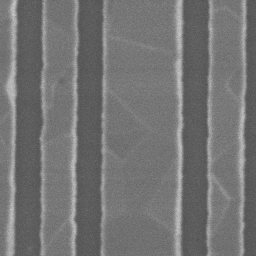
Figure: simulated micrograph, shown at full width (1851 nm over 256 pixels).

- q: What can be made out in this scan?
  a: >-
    lines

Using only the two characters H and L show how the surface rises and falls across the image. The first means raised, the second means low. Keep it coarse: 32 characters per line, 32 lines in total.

HHLLLHHHHHLLLHHHHHHHHHHLLLHHHHHL
HHLLLHHHHHLLLHHHHHHHHHHLLLHHHHHL
HHLLLHHHHHLLLHHHHHHHHHHLLLHHHHHL
HHLLLHHHHHLLLHHHHHHHHHHLLLHHHHHL
HHLLLHHHHHLLLHHHHHHHHHHLLLHHHHHL
HHLLLHHHHHLLLHHHHHHHHHHLLLHHHHHL
HHLLLHHHHHLLLHHHHHHHHHHLLLHHHHHL
HHLLLHHHHHLLLHHHHHHHHHHLLLHHHHHL
HHLLLHHHHHLLLHHHHHHHHHHLLLHHHHHL
HHLLLHHHHHLLLHHHHHHHHHHLLLHHHHHL
HHLLLHHHHHLLLHHHHHHHHHHLLLHHHHHL
HHLLLHHHHHLLLHHHHHHHHHHLLLHHHHHL
HHLLLHHHHHLLLHHHHHHHHHHLLLHHHHLL
HHLLLHHHHHLLLHHHHHHHHHHLLLHHHHLL
HHLLLHHHHHLLLHHHHHHHHHHLLLHHHHHL
HHLLLHHHHHLLLHHHHHHHHHHLLLHHHHLL
HHLLLHHHHLLLLHHHHHHHHHHLLLHHHHLL
HHLLLHHHHHLLLHHHHHHHHHHLLLHHHHLL
HHLLLHHHHHLLLHHHHHHHHHHLLLHHHHLL
HHLLLHHHHHLLLHHHHHHHHHHLLLHHHHLL
HHLLLHHHHLLLLHHHHHHHHHHLLLHHHHLL
HHLLLHHHHLLLLHHHHHHHHHHLLLHHHHLL
HHLLLHHHHLLLLHHHHHHHHHHLLLHHHHLL
HHLLLHHHHLLLLHHHHHHHHHHLLLHHHHLL
HHLLLHHHHHLLLHHHHHHHHHHLLLHHHHLL
HHLLLHHHHLLLLHHHHHHHHHHLLLHHHHLL
HHLLLHHHHLLLLHHHHHHHHHHLLLHHHHLL
HHLLLHHHHLLLLHHHHHHHHHHLLLHHHHLL
HHLLLHHHHHLLLHHHHHHHHHHLLLHHHHLL
HHLLLHHHHLLLLHHHHHHHHHLLLLHHHHLL
HHLLLHHHHLLLLHHHHHHHHHHLLLHHHHLL
HHLLLHHHHLLLLHHHHHHHHHHLLLHHHHLL